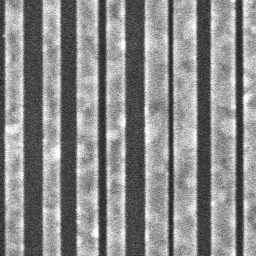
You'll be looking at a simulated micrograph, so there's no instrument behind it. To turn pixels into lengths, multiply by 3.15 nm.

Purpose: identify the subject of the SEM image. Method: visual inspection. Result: parallel lines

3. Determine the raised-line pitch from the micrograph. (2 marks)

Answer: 34.8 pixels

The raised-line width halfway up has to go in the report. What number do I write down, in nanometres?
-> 63.4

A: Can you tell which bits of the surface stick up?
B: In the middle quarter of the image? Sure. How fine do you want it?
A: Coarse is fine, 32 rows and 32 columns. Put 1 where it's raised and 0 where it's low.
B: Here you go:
00011111000111100000111111001111
00011111000111100000111111001111
00011111000111100000111111001111
00011111000111100000011111001111
00011111000111100000011111001111
00011111000111100000011111001111
00011111000111100000011111001111
00011111000111100000011111001111
00011111000111100000011111001111
00011111000111100000011111001111
00011111000111100000011111001111
00011111000111100000011111001111
00011111000111100000011111001111
00011111000111100000011111001111
00011111000111100000011111001111
00011111000111100000011111001111
00011111000111100000011111001111
00011111000111100000011111001111
00011111000111100000011111001111
00011111000111100000011111001111
00011111000111100000011111001111
00011111000111100000011111001111
00011111000111100000011111001111
00011111000111100000011111001111
00011111000111100000011111001111
00011111000111100000011111001111
00011111000111100000011111001111
00011111000111100000011111001111
00011111000111100000011111001111
00011111000111100000011111001111
00011111000111100000011111001111
00011111000111100000011111001111